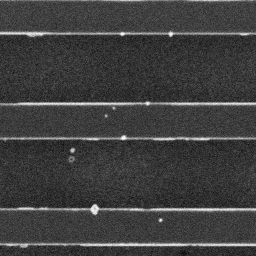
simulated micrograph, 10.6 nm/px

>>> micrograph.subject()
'lines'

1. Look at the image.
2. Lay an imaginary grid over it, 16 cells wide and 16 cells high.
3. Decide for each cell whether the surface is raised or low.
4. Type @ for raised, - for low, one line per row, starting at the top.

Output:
@@@@@@@@@@@@@@@@
@@@@@@@@@@@@@@@@
----------------
----------------
----------------
----------------
-@@@@@@@@@@@@@@@
@@@@@@@@@@@@@@@@
@@@@@@@@@@@@@@@@
----------------
----------------
----------------
----------------
@@@@@@@@@@@@@@@@
@@@@@@@@@@@@@@@@
----------------